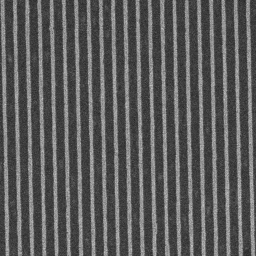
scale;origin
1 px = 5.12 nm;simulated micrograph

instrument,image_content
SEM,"parallel lines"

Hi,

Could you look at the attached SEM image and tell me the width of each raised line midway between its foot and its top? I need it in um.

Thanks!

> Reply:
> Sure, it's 0.0173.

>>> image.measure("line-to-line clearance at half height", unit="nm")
46.7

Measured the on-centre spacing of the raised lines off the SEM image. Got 12.3 pixels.